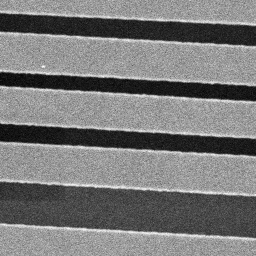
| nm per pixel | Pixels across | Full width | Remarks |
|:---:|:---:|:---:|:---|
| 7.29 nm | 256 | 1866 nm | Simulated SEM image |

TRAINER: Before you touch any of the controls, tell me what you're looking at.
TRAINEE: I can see lines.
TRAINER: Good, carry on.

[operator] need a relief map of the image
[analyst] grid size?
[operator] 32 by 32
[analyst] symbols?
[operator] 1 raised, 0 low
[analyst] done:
11111111111111111111111111111111
11111111111111111111111111111111
00000000000000000001111111111111
00000000000000000000000000000000
11111111100000000000000000000000
11111111111111111111111111100000
11111111111111111111111111111111
11111111111111111111111111111111
11111111111111111111111111111111
00000000001111111111111111111111
00000000000000000000000000001111
11111111111000000000000000000000
11111111111111111111111111110000
11111111111111111111111111111111
11111111111111111111111111111111
01111111111111111111111111111111
00000000000000000011111111111111
00000000000000000000000000000000
11111111111110000000000000000000
11111111111111111111111111111111
11111111111111111111111111111111
11111111111111111111111111111111
11111111111111111111111111111111
00000000000000111111111111111111
00000000000000000000000000000000
00000000000000000000000000000000
00000000000000000000000000000000
00000000000000000000000000000000
11111111110000000000000000000000
11111111111111111111111111000000
11111111111111111111111111111111
11111111111111111111111111111111